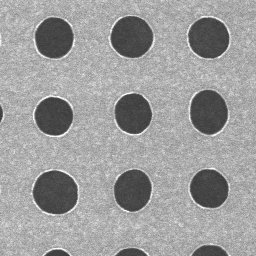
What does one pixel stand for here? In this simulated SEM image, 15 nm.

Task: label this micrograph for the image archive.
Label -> a regular array of holes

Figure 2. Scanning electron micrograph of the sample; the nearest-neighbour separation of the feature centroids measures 1.15 microns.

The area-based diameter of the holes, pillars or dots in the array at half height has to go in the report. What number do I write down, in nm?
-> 597